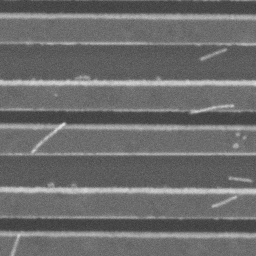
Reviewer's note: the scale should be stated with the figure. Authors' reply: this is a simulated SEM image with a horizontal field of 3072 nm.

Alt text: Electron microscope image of lines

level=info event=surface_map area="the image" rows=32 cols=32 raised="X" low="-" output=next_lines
--------------------------------
--------------------------------
XXXXXXXXXXXXXXXXXXXXXXXXXXXXXXXX
XXXXXXXXXXXXXXXXXXXXXXXXXXXXXXXX
XXXXXXXXXXXXXXXXXXXXXXXXXXXXXXXX
---------------------------XX-XX
--------------------------------
--------------------------------
--------------------------------
--------------------------------
XXXXXXXXXXXXXXXXXXXXXXXXXXXXXXXX
XXXXXXXXXXXXXXXXXXXXXXXXXXXXXXXX
XXXXXXXXXXXXXXXXXXXXXXXXXXXXXXXX
XXXXXXXXXXXXXXXXXXXXXXXXXXXXXXXX
--------------------------------
--------------------------------
XXXXXXXXXXXXXXXXXXXXXXXXXXXXXXXX
XXXXXXXXXXXXXXXXXXXXXXXXXXXXXXXX
XXXXXXXXXXXXXXXXXXXXXXXXXXXXXXXX
--------------------------------
--------------------------------
--------------------------------
--------------------------------
--------------------------------
XXXXXXXXXXXXXXXXXXXXXXXXXXXXXXXX
XXXXXXXXXXXXXXXXXXXXXXXXXXXXXXXX
XXXXXXXXXXXXXXXXXXXXXXXXXXXXXXXX
--------------------------------
--------------------------------
XXXXXXXXXXXXXXXXXXXXXXXXXXXXXXXX
XXXXXXXXXXXXXXXXXXXXXXXXXXXXXXXX
XXXXXXXXXXXXXXXXXXXXXXXXXXXXXXXX